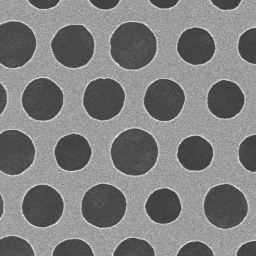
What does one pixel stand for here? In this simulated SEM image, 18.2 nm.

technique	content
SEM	a regular array of holes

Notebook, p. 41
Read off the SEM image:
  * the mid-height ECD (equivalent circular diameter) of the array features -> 41.9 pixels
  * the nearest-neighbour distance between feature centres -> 1100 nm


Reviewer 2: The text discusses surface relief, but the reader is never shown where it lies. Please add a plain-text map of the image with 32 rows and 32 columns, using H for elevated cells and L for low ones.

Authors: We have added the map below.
HHHHLLLHHHHHLLLHHHHLLLHHHHHLLLHH
HHHHHHHHHHHHHHHHHHHHHHHHHHHHHHHH
HHHHHHHHHHHHHHHHHHHHHHHHHHHHHHHH
LLLLHHHHLLLHHHHLLLLHHHHHLHHHHHHH
LLLLHHHLLLLHHHLLLLLHHHLLLLHHHHLL
LLLLLHLLLLLLHHLLLLLLHHLLLLLHHHLL
LLLLHHHLLLLLHHLLLLLHHHLLLLLHHHLL
LLLLHHHLLLLHHHLLLLLHHHHLLLHHHHHL
HLHHHHHHHHHHHHHLLLHHHHHHHHHHHHHH
HHHHHHHHHHHHHHHHHHHHHHHHHHHHHHHH
HHHHLLLHHHHLLLLHHHHLLLHHHHHLLHHH
LHHLLLLLHHHLLLLLHHLLLLLHHHLLLLHH
LHHLLLLLHHLLLLLLHHLLLLLHHHLLLLLH
LHHLLLLLHHHLLLLHHHLLLLLHHHLLLLHH
HHHHLLLHHHHLLLHHHHHLLLHHHHHLLHHH
HHHHHHHHHHHHHHHHHHHHHHHHHHHHHHHH
LLLHHHHHHHHHHHHLLLHHHHHHHHHHHHHH
LLLLHHHLLLLHHHLLLLLHHHHLLLHHHHLL
LLLLHHHLLLLHHHLLLLLLHHLLLLHHHHLL
LLLLHHHLLLLHHHLLLLLLHHLLLLLHHHLL
LLLLHHHLLLLHHHLLLLLHHHHLLLHHHHLL
LLLHHHHHHHHHHHHLLLHHHHHHHHHHHHHH
HHHHHHHHHHHHHHHHHHHHHHHHHHHHHHHH
HHHHLLLHHHHLLLLHHHHHHHHHHHHLLHHH
HHHLLLLLHHHLLLLLHHHLLLHHHHLLLLLH
LHHLLLLLHHLLLLLLHHLLLLLHHLLLLLLH
HHHLLLLLHHLLLLLLHHLLLLLHHHLLLLLH
HHHLLLLHHHHLLLLHHHHLLLHHHHLLLLHH
HHHHHHHHHHHHHHHHHHHHHHHHHHHHLHHH
HLHHHHHHHHHHHHHHHHHHHHHHHHHHHHHH
LLLLHHHLLLLHHHHLLLLHHHHLLLHHHHHL
LLLLHHHLLLLLHHLLLLLHHHLLLLLHHHLL